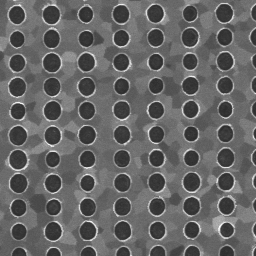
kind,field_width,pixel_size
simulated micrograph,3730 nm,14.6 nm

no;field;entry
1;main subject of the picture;a regular array of holes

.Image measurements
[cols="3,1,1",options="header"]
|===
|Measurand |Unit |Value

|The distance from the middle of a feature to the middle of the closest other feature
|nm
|348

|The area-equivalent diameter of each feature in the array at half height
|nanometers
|246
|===